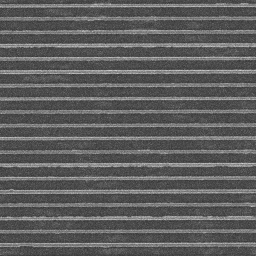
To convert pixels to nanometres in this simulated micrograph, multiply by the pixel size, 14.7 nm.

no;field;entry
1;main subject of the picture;parallel lines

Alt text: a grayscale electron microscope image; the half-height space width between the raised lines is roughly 156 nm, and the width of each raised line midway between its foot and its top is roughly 44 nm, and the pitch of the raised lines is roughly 195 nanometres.